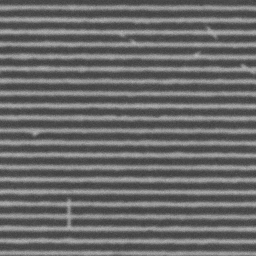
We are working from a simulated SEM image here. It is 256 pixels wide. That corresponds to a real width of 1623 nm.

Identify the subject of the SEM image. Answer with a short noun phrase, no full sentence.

parallel lines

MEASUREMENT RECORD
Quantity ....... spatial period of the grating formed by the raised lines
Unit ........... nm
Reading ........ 77.8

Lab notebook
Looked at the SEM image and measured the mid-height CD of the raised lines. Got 23 nm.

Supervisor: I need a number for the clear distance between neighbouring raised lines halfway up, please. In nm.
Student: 57.9